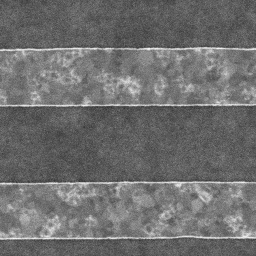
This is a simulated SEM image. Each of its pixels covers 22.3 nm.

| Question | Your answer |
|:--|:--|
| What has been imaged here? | one or a few lines or trenches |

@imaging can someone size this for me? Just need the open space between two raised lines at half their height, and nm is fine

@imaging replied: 1720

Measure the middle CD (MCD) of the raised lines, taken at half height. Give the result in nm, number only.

1240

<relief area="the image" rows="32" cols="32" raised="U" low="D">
DDDDDDDDDDDDDDDDDDDDDDDDDDDDDDDD
DDDDDDDDDDDDDDDDDDDDDDDDDDDDDDDD
DDDDDDDDDDDDDDDDDDDDDDDDDDDDDDDD
DDDDDDDDDDDDDDDDDDDDDDDDDDDDDDDD
DDDDDDDDDDDDDDDDDDDDDDDDDDDDDDDD
DDDDDDDDDDDDDDDDDDDDDDDDDDDDDDDD
UUUUUUUUUUUUUUUUUUUUUUUUUUUUUUUU
UUUUUUUUUUUUUUUUUUUUUUUUUUUUUUUU
UUUUUUUUUUUUUUUUUUUUUUUUUUUUUUUU
UUUUUUUUUUUUUUUUUUUUUUUUUUUUUUUU
UUUUUUUUUUUUUUUUUUUUUUUUUUUUUUUU
UUUUUUUUUUUUUUUUUUUUUUUUUUUUUUUU
UUUUUUUUUUUUUUUUUUUUUUUUUUUUUUUU
DDDDDDDDDDDDDDDDDDDDDDDDDDDDDDDD
DDDDDDDDDDDDDDDDDDDDDDDDDDDDDDDD
DDDDDDDDDDDDDDDDDDDDDDDDDDDDDDDD
DDDDDDDDDDDDDDDDDDDDDDDDDDDDDDDD
DDDDDDDDDDDDDDDDDDDDDDDDDDDDDDDD
DDDDDDDDDDDDDDDDDDDDDDDDDDDDDDDD
DDDDDDDDDDDDDDDDDDDDDDDDDDDDDDDD
DDDDDDDDDDDDDDDDDDDDDDDDDDDDDDDD
DDDDDDDDDDDDDDDDDDDDDDDDDDDDDDDD
DDDDDDDDDDDDDDDDDDDDDDDDDDDDDDDD
UUUUUUUUUUUUUUUUUUUUUUUUUUUUUUUU
UUUUUUUUUUUUUUUUUUUUUUUUUUUUUUUU
UUUUUUUUUUUUUUUUUUUUUUUUUUUUUUUU
UUUUUUUUUUUUUUUUUUUUUUUUUUUUUUUU
UUUUUUUUUUUUUUUUUUUUUUUUUUUUUUUU
UUUUUUUUUUUUUUUUUUUUUUUUUUUUUUUU
UUUUUUUUUUUUUUUUUUUUUUUUUUUUUUDU
DDDDDDDDDDDDDDDDDDDDDDDDDDDDDDDD
DDDDDDDDDDDDDDDDDDDDDDDDDDDDDDDD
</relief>